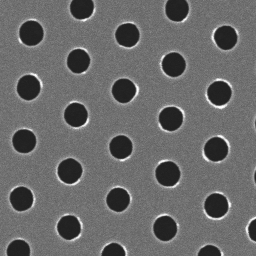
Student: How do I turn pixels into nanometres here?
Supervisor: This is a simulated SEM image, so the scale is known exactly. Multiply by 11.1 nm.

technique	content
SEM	a regular array of holes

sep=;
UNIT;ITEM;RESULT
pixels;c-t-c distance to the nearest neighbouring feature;54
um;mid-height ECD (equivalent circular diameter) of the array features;0.267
